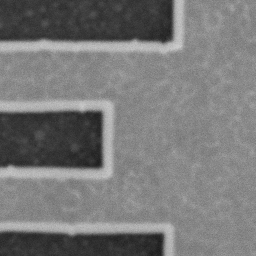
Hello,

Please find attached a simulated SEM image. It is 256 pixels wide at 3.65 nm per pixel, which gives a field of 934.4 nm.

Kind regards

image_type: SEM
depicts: one or a few lines or trenches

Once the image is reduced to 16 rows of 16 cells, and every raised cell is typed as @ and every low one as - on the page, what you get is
-----------@@@@@
-----------@@@@@
-----------@@@@@
@@@@@@@@@@@@@@@@
@@@@@@@@@@@@@@@@
@@@@@@@@@@@@@@@@
@@@@@@@@@@@@@@@@
-------@@@@@@@@@
-------@@@@@@@@@
-------@@@@@@@@@
-------@@@@@@@@@
@@@@@@@@@@@@@@@@
@@@@@@@@@@@@@@@@
@@@@@@@@@@@@@@@@
----------@@@@@@
----------@@@@@@